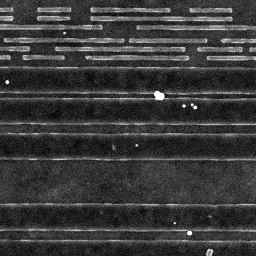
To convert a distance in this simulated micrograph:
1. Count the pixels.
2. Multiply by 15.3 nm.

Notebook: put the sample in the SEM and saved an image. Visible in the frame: wiring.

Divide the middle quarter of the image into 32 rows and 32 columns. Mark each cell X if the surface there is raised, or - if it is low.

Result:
--------------------------------
XXXXXXXXXXXXXXXXXXXXXXXXXXXXXXXX
XXXXXXXXXXXXXXXXXXXXXXXXXXXXXXXX
XXXXXXXXXXXXXXXXXXXXXXXXXXXXXXXX
XXXXXXXXXXXXXXXXXXXXXXXXXXXXXXXX
XXXXXXXXXXXXXXXXXXXXXXXXXXXXXXXX
XXXXXXXXXXXXXXXXXXXXXXXXXXXXXXXX
----------------------XXX-------
----------------------XXX-------
XXXXXXXXXXXXXXXXXXXXXXXXXXXXXXXX
XXXXXXXXXXXXXXXXXXXXXXXXXXXXXXXX
XXXXXXXXXXXXXXXXXXXXXXXXXXXXXXXX
XXXXXXXXXXXXXXXXXXXXXXXXXXXXXXXX
XXXXXXXXXXXXXXXXXXXXXXXXXXXXXXXX
XXXXXXXXXXXXXXXXXXXXXXXXXXXXXXXX
--------------------------------
--------------------------------
--------------------------------
XXXXXXXXXXXXXXXXXXXXXXXXXXXXXXXX
XXXXXXXXXXXXXXXXXXXXXXXXXXXXXXXX
XXXXXXXXXXXXXXXXXXXXXXXXXXXXXXXX
XXXXXXXXXXXXXXXXXXXXXXXXXXXXXXXX
XXXXXXXXXXXXXXXXXXXXXXXXXXXXXXXX
XXXXXXXXXXXXXXXXXXXXXXXXXXXXXXXX
--------------------------------
--------------------------------
--------------------------------
--------------------------------
--------------------------------
--------------------------------
--------------------------------
--------------------------------